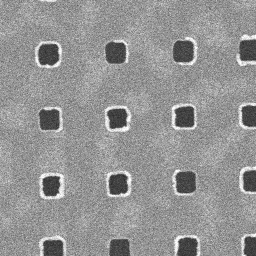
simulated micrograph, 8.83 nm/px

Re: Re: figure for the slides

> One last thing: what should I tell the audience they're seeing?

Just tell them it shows a regular array of holes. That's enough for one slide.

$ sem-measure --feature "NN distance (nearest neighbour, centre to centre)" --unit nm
578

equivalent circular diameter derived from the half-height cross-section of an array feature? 200 nm